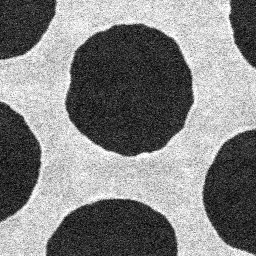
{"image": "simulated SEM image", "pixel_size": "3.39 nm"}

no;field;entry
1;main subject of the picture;holes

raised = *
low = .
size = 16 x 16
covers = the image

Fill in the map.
....**********..
...*****.*****..
...**......****.
.****.......***.
****........****
****........****
****........****
..**........****
..***......****.
...****...****..
...**********...
..***********...
..****..*****...
.***......***...
***........**...
***........****.